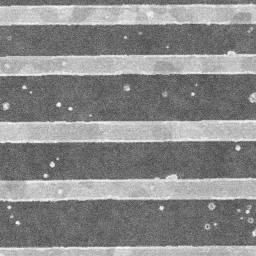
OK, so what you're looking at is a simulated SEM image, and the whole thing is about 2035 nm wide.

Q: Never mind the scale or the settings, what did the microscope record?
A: lines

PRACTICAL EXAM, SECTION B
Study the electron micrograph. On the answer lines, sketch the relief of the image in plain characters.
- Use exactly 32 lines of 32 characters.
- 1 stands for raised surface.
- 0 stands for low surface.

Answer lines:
00000000000000000000000000000000
11111111111111111111111111111111
11111111111111111111111111111111
00000000000000000000000000000000
00000000000000000000000000000000
00000000000000000000000000000000
00000000000000000000000000000000
11111111111111111111111111111111
11111111111111111111111111111111
00000000000000000000000000000000
00000000000000000000000000000000
00000000000000000000000000000000
00000000000000000000000000000000
00000000000000000000000000000000
00000000000000000000000000000000
11111111111111111111111111111111
11111111111111111111111111111111
11111111111111111111100000000000
00000000000000000000000000000000
00000000000000000000000000000000
00000000000000000000000000000000
00000000000000000000000000000000
00000000000000000000010000000011
11111111111111111111111111111111
11111111111111111111111111111111
00000000000000000000000000000000
00000000000000000000000000000000
00000000000000000000000000000000
00000000000000000000000000000000
00000000000000000000000000000000
00000000000000000000000000000000
11111111111111111111111111111111